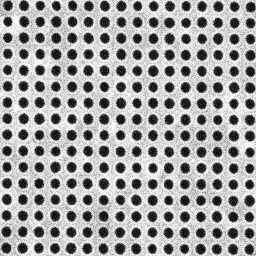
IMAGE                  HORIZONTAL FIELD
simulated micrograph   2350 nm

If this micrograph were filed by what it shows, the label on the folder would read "a regular array of holes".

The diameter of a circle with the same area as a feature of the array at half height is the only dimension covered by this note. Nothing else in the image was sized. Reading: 98.8 nm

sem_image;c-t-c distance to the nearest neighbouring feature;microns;0.146